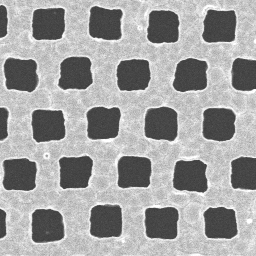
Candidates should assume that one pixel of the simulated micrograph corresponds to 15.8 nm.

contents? a regular array of holes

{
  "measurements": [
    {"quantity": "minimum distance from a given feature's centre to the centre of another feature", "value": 55.7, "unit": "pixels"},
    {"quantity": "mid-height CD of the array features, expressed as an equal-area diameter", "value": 0.555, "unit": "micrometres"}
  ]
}